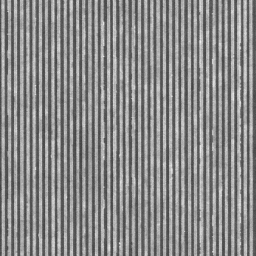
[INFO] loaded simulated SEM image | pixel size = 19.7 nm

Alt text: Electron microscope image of parallel lines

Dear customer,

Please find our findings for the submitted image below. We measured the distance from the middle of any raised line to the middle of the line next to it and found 0.122 um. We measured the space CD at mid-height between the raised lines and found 0.0715 micrometres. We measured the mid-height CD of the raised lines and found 56.7 nanometres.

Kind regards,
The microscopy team